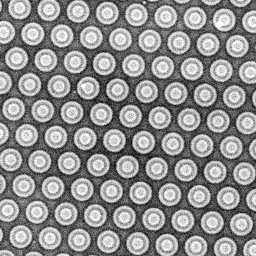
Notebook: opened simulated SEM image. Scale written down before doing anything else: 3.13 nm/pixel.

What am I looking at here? an array of small figures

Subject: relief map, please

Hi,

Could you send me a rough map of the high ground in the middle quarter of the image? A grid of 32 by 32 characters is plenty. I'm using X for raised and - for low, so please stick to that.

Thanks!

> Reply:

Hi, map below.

XXXXX--XXXXXX--XXXXX--XXXXX--XXX
-XXXX---XXXX---XXXXX--XXXXX--XXX
---------XX-----XXX----XXXX---XX
X----XX-----------------------XX
X---XXXX---XXXX----XXX----------
X--XXXXXX--XXXXX--XXXXX---XXXX--
X--XXXXXX--XXXXX--XXXXX--XXXXXX-
X---XXXX---XXXXX--XXXXX--XXXXXX-
-----XX-----XXX---XXXXX---XXXX--
--------------------XX----XXXX--
XXXX----XXX-----XX--------------
XXXXX--XXXXX--XXXXX---XXXX----XX
XXXXX--XXXXX--XXXXX--XXXXXX--XXX
XXXX---XXXXX--XXXXX--XXXXXX--XXX
-XX----XXXX---XXXXX--XXXXXX--XXX
----------------XX----XXXX---XXX
----XXX-----X------------------X
X--XXXXX--XXXXX---XXXX----XX----
X--XXXXX--XXXXX--XXXXX---XXXXX--
---XXXXX--XXXXX--XXXXXX--XXXXX--
---XXXX---XXXXX--XXXXX---XXXXX--
-----------XXX----XXXX---XXXXX--
XXX-----------------------XX----
XXXX---XXXX---XXXX----XX--------
XXXX--XXXXX--XXXXX---XXXX----XXX
XXXX--XXXXX--XXXXXX--XXXXX--XXXX
XXX---XXXXX--XXXXX---XXXXX--XXXX
-------XXX----XXXX---XXXXX--XXXX
----------------------XXX----XXX
---XXXX---XXX-------------------
--XXXXX--XXXXX---XXXX----XXX----
--XXXXX--XXXXXX--XXXXX--XXXXX---